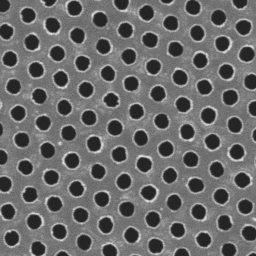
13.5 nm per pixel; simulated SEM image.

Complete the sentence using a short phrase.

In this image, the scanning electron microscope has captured a regular array of holes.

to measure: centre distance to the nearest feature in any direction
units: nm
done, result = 357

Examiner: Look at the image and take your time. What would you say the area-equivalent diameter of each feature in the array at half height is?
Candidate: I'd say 204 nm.